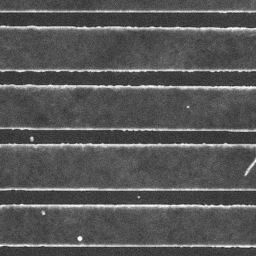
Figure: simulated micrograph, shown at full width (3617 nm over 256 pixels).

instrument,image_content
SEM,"lines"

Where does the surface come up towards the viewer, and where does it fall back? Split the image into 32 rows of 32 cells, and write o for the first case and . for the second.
oooooooooooooooooooooooooooooooo
................................
................................
oooooooooo..ooooooooo...........
oooooooooooooooooooooooooooooooo
oooooooooooooooooooooooooooooooo
oooooooooooooooooooooooooooooooo
oooooooooooooooooooooooooooooooo
oooooooooooooooooooooooooooooooo
................................
................................
oooooooooooooooooooooooooooooooo
oooooooooooooooooooooooooooooooo
oooooooooooooooooooooooooooooooo
oooooooooooooooooooooooooooooooo
oooooooooooooooooooooooooooooooo
................................
................................
oooooooooooooooooooooooooooooooo
oooooooooooooooooooooooooooooooo
oooooooooooooooooooooooooooooooo
oooooooooooooooooooooooooooooooo
oooooooooooooooooooooooooooooooo
oooooooooooooooooooooooooooooooo
................................
................................
oooooooooooooooooooooooooooooooo
oooooooooooooooooooooooooooooooo
oooooooooooooooooooooooooooooooo
oooooooooooooooooooooooooooooooo
oooooooooooooooooooooooooooooooo
................................